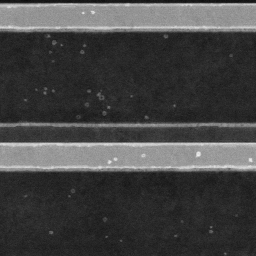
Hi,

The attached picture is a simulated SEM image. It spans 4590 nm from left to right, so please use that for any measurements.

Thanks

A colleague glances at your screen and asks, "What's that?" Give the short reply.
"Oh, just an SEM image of lines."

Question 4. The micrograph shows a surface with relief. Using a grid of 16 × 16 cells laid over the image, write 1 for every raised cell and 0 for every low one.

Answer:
1111111111111111
1111111111111111
0000000000000000
0000000000000000
0000000000000000
0000000000000000
0000000000000000
0000000000000000
1111111111111111
1111111111111111
0011111110011011
0000000000000000
0000000000000000
0000000000000000
0000000000000000
0000000000000000